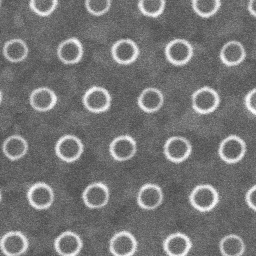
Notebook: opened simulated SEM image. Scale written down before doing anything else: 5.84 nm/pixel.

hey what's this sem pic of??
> a regular array of holes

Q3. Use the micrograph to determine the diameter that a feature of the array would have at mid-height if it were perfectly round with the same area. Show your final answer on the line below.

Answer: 121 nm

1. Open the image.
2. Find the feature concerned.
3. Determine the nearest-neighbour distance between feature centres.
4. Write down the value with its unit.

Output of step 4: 0.316 microns